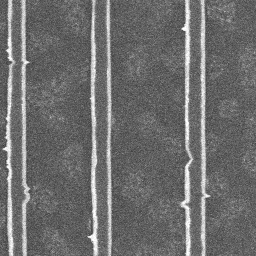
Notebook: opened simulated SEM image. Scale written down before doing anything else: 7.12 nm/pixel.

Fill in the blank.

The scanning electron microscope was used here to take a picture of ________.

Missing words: one or a few lines or trenches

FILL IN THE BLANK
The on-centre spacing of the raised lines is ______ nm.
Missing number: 635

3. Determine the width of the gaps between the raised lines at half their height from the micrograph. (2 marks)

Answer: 510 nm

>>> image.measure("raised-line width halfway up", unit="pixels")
16.6